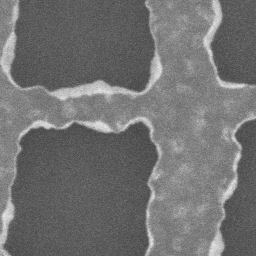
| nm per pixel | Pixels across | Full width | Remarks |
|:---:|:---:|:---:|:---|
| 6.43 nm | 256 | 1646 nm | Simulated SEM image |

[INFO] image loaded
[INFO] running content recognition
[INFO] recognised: holes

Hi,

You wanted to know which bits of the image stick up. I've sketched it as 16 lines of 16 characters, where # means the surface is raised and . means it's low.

#........#####..
#........####...
#.........###...
..........###...
..........####..
###......#######
################
################
#........######.
#.........#####.
#.........#####.
#........######.
#........#####..
.........#####..
.........#####..
.........#####..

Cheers